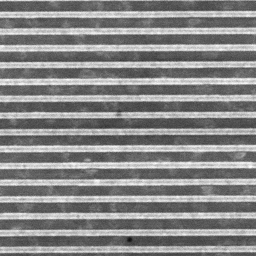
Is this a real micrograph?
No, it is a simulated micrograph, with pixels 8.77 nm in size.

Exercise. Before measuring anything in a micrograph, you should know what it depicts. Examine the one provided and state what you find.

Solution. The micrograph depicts parallel lines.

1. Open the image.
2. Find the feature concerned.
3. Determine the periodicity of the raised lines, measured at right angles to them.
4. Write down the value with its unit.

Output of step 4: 147 nm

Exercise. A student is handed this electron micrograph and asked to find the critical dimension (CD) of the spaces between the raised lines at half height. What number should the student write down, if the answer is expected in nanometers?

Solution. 103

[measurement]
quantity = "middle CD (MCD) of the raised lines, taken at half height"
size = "41.6 nanometers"